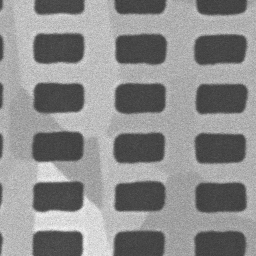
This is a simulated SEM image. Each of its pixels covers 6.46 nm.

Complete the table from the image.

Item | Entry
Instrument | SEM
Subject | a regular array of holes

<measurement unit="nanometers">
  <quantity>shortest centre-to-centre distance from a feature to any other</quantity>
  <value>318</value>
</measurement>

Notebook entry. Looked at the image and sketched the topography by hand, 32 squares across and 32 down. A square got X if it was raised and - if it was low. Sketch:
XXXX-------XXX-------XXXX------X
XXXXX-----XXXXX-----XXXXX-----XX
XXXXXXXXXXXXXXXXXXXXXXXXXXXXXXXX
XXXXXXXXXXXXXXXXXXXXXXXXXXXXXXXX
XXXXX-----XXXXX-----XXXXX-----XX
-XXX-------XXX-------XXX-------X
XXXX-------XXX-------XXX-------X
XXXX------XXXXX------XXX------XX
XXXXXXXXXXXXXXXXXXXXXXXXXXXXXXXX
XXXXXXXXXXXXXXXXXXXXXXXXXXXXXXXX
XXXXX-----XXXXX-----XXXXX-XX--XX
XXXX-------XXX-------XXXX------X
XXXX-------XXX-------XXX-------X
XXXX------XXXX-------XXX-------X
XXXXXXXXXXXXXXXXXXXXXXXXXXXXXXXX
XXXXXXXXXXXXXXXXXXXXXXXXXXXXXXXX
XXXXXXX---XXXXXXXXXXXXXXXXXXXXXX
XXXX------XXXX-------XXX-------X
XXXX------XXXX-------XXX-------X
XXXX------XXXX------XXXX-------X
XXXXXXXXXXXXXXXXXXXXXXXXX--XXXXX
XXXXXXXXXXXXXXXXXXXXXXXXXXXXXXXX
XXXXXXXXXXXXXXXXXXXXXXXXXXXXXXXX
XXXX------XXXX-------XXXX------X
XXXX------XXXX-------XXX-------X
XXXX------XXXX-------XXX-------X
XXXXXXXXXXXXXXX---XXXXXXX--X--XX
XXXXXXXXXXXXXXXXXXXXXXXXXXXXXXXX
XXXXXXXXXXXXXXXXXXXXXXXXXXXXXXXX
XXXX------XXXX-------XXXX------X
XXXX------XXXX-------XXX-------X
XXXX------XXXX-------XXX-------X